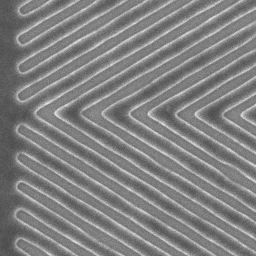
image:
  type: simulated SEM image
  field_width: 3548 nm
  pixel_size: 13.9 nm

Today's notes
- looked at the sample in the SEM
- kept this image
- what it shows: groups of lines, slits or small figures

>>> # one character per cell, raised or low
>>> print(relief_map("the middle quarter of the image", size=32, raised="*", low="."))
.....*******.....*******.....***
...*******.....*******.....*****
..******......******.....*******
******......******......******..
*****.....*******.....*******...
***.....*******.....*******.....
**.....*******.....*******....**
.....*******.....*******....****
...*******.....*******.....*****
..******.....********....*******
*******.....*******....********.
*****.....*******.....*******...
****......******.....*******....
*****.....*******.....*******...
.******.....*******.....******..
..*******....*******.....*******
....*******....*******.....*****
.....*******.....******.....****
**.....*******....*******.....**
***.....*******.....*******....*
*****.....*******.....*******...
*******.....******.....*******..
..*******.....******.....*******
....******.....******......*****
.....*******.....******.....****
**.....******.....******......**
****....*******.....******.....*
*****.....******.....*******....
*******.....******.....*******..
..******.....*******....*******.
...*******.....*******....******
.....******.....*******.....****